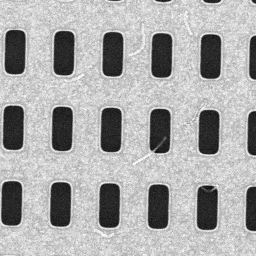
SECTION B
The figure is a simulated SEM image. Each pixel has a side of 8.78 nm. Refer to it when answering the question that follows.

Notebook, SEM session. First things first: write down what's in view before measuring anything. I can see groups of lines, slits or small figures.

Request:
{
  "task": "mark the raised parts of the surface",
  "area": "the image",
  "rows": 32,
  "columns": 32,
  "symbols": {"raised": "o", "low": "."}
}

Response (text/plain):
oooooooooooooooooooooooooooooooo
oooooooooooooooooooooooooooooooo
oooooooooooooooooooooooooooooooo
oooooooooooooooooooooooooooooooo
o..oooo..oooo..oooo..oooo..ooooo
o..oooo..oooo...ooo...ooo...ooo.
o..oooo..oooo...ooo...ooo...ooo.
...oooo..oooo..oooo...ooo...ooo.
o..oooo..oooo..oooo...ooo...ooo.
ooooooooooooo..oooo..oooo..oooo.
oooooooooooooooooooooooooooooooo
oooooooooooooooooooooooooooooooo
oooooooooooooooooooooooooooooooo
o..oooo..oooo..ooooooooooooooooo
...oooo..oooo..oooo..oooo..oooo.
...ooo...oooo..oooo..oooo...ooo.
...ooo...ooo...oooo..oooo..oooo.
...ooo...ooo...oooo..oooo..oooo.
o..oooo..oooo..oooo..oooo..oooo.
oooooooooooooooooooooooooooooooo
oooooooooooooooooooooooooooooooo
oooooooooooooooooooooooooooooooo
oooooooooooooooooooooooooooooooo
...ooo...ooo...oooo..oooo..oooo.
...ooo...ooo...ooo...oooo..oooo.
...ooo...ooo...ooo...ooo...oooo.
...ooo...ooo...ooo...ooo...oooo.
...ooo...ooo...ooo...ooo...oooo.
ooooooooooooo.ooooo..oooo..oooo.
oooooooooooooooooooooooooooooooo
oooooooooooooooooooooooooooooooo
oooooooooooooooooooooooooooooooo